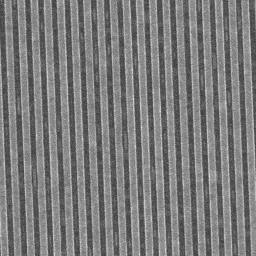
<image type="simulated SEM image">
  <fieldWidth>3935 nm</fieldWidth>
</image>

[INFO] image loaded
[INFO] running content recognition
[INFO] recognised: parallel lines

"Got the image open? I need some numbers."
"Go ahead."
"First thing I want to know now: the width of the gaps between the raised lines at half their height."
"104 nm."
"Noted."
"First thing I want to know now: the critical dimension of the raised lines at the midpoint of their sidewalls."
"104 nm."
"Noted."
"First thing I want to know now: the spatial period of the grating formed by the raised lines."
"202 nm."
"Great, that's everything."